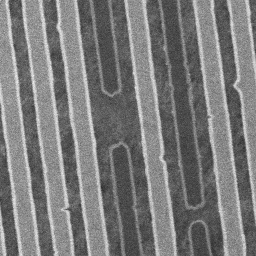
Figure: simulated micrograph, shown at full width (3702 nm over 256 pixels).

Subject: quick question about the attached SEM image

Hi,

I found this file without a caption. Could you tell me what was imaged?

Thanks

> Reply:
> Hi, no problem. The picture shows parallel lines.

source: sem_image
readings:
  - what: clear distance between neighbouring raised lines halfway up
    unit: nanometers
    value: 228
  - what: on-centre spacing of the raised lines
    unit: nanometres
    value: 492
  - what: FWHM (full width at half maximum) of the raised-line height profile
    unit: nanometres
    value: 264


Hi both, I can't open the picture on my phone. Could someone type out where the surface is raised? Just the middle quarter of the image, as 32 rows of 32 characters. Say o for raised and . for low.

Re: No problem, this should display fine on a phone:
.oooo....oooo....ooooo....oooo..
.oooo....oooo.....oooo....ooooo.
.oooo....ooooo....oooo....ooooo.
.oooo....ooooo....oooo....ooooo.
.oooo....ooooo....oooo.....oooo.
.oooo.....oooo....ooooo....ooooo
.ooooo....oooo....ooooo....oooo.
.ooooo.....o......ooooo....oooo.
.ooooo............ooooo....ooooo
.ooooo.............oooo....ooooo
..oooo.............oooo.....oooo
..oooo.............oooo....ooooo
..oooo.............oooo.....oooo
..oooo.............ooooo....oooo
..ooooo............ooooo....oooo
..ooooo.............oooo....oooo
..ooooo.............oooo....oooo
...oooo.............oooo....oooo
...oooo.............oooo....oooo
...oooo.............oooo....oooo
...ooooo.....oo.....oooo.....ooo
...ooooo....oooo....ooooo....ooo
...ooooo....oooo....ooooo....ooo
...ooooo....oooo....oooo.....ooo
....oooo....oooo.....oooo....ooo
....oooo....ooooo....oooo....ooo
....oooo....ooooo....oooo....ooo
....oooo....ooooo....oooo....ooo
....oooo....ooooo....oooo.....oo
....oooo.....oooo....ooooo....oo
....ooooo....oooo....ooooo....oo
....ooooo....oooo....ooooo....oo